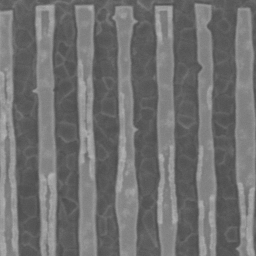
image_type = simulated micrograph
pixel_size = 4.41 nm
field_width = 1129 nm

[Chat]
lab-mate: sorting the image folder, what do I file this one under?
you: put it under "parallel lines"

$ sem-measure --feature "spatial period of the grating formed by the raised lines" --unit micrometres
0.175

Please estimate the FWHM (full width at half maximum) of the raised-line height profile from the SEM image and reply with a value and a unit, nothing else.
72.8 nm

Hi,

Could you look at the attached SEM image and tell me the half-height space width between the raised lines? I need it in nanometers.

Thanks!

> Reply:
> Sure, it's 103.